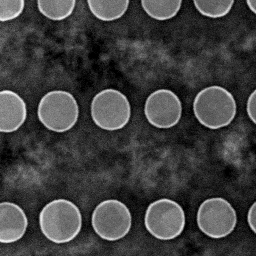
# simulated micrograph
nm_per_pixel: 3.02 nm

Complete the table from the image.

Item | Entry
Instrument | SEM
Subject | a regular array of raised bodies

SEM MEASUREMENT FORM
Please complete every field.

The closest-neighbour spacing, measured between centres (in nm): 156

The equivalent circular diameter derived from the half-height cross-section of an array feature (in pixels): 39.3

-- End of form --